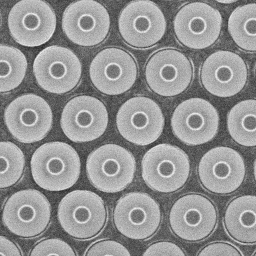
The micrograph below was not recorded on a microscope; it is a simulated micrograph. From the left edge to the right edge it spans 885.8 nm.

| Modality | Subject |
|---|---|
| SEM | an array of small figures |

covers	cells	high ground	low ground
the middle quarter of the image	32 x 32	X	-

XXXX---XXXXXXXXXXX-X-XXXXXXXXXXX
XXXX---XXXXXXXXXXX---XXXXXXXXXXX
XXXX---XXXXXXXXXXX---XXXXXXXXXXX
XXXX---XXXXXXXXXXX---XXXXXXXXXXX
XXXX---XXXXXXXXXXX---XXXXXXXXXX-
XXX-----XXXXXXXXX----XXXXXXXXXX-
X--------XXXXXXX----X-XXXXXXXX--
-----------XXX-----XX---XXXX----
--XXXXXX---------XXXX-----------
-XXXXXXXX-------XXXXXXX-------XX
XXXXXXXXXX----XXXXXXXXX------XXX
XXXXXXXXXXX---XXXXXXXXXX----XXXX
XXXXXXXXXXX--XXXXXXXXXXX---XXXXX
XXXXXXXXXXX--XXXXXXXXXXXX--XXXXX
XXXXXXXXXXX--XXXXXXXXXXXX--XXXXX
XXXXXXXXXXX--XXXXXXXXXXX---XXXXX
XXXXXXXXXX----XXXXXXXXXX---XXXXX
-XXXXXXXXX----XXXXXXXXXX----XXXX
--XXXXXX-------XXXXXXXX------XXX
-----------------XXXX---------XX
X---------XXXX-----------XX-----
XX------XXXXXXX-------XXXXXXX---
XXX----XXXXXXXXX-----XXXXXXXXX--
XXX---XXXXXXXXXXX---XXXXXXXXXXX-
XXX---XXXXXXXXXXX---XXXXXXXXXXX-
XXXX--XXXXXXXXXXX---XXXXXXXXXXX-
XXXX--XXXXXXXXXXX---XXXXXXXXXXX-
XXX---XXXXXXXXXXX---XXXXXXXXXXX-
XXX----XXXXXXXXXX---XXXXXXXXXXX-
XX-----XXXXXXXXX-----XXXXXXXXX--
X-------XXXXXXX-------XXXXXXX---
----------XXX----------XXXXX----